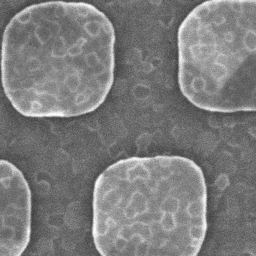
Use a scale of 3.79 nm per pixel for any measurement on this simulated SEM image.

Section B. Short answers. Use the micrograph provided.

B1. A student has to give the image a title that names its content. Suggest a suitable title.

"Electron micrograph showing raised bodies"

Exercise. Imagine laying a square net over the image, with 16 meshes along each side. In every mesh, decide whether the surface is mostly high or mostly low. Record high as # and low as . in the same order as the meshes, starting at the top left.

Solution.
..####......####
.######....#####
#######....#####
#######....#####
#######....#####
#######....#####
.#####......####
................
................
................
#......#####....
##....#######...
##....#######...
##....#######...
##....#######...
##....#######...